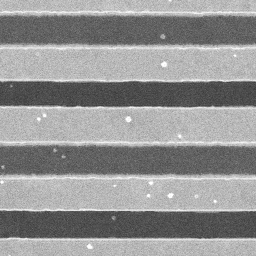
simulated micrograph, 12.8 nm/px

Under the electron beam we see lines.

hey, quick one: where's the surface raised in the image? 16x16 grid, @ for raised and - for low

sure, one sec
@@@@@@@@@@@@@@@@
----------------
----------------
@@@@@@@@@@@@@@@@
@@@@@@@@@@@@@@@@
----------------
----------------
@@@@@@@@@@@@@@@@
@@@@@@@@@@@@@@@@
----------------
----------------
@@@@@@@@@@@@@@@@
@@@@@@@@@@@@@@@@
----------------
----------------
@@@@@@@@@@@@@@@@